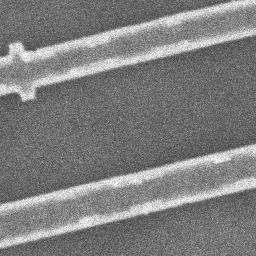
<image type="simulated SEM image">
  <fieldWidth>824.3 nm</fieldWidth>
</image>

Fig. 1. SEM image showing one or a few lines or trenches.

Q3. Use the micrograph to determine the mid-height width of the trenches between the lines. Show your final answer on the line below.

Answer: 358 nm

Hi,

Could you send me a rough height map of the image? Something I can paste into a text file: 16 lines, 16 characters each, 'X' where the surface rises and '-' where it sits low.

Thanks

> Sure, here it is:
--------------XX
---------XXXXXXX
------XXXXXXXX--
XXXXXXXXXX------
XXXXXX----------
XX--------------
----------------
----------------
----------------
--------------XX
----------XXXXXX
------XXXXXXXXXX
--XXXXXXXXXX----
XXXXXXXX--------
XXXX------------
----------------